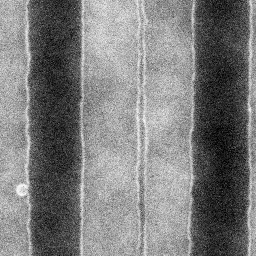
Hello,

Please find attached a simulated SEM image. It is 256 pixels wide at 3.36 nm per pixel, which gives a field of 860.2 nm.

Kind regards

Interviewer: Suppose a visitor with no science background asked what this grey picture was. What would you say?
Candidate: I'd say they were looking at lines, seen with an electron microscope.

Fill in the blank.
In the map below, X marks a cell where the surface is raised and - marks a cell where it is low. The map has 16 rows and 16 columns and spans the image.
--XXX-------XXXX
--XXX-------XXXX
--XXX------XXXXX
--XXX-------XXXX
--XXX-------XXXX
--XXX-------XXXX
--XXX-------XXXX
--XXX-------XXXX
--XXX-------XXXX
--XXX-------XXXX
--XXX-------XXXX
-XXXX-----XXXXXX
--XXX-----XXXXXX
--XXX---X-XXXXXX
--XXX---X---XXXX
--XXX-------XXXX